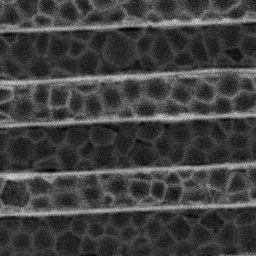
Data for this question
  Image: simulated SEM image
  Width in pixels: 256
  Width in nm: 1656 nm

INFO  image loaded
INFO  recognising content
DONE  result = one or a few lines or trenches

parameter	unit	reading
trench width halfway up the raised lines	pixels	49.6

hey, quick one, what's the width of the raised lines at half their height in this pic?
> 270 nm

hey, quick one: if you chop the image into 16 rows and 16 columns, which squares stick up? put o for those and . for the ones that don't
oooooooooooooooo
ooooooooooo.....
................
................
............oooo
oooooooooooooooo
oooooooooooooooo
oooooooo........
................
................
...........ooooo
oooooooooooooooo
oooooooooooooooo
................
................
................